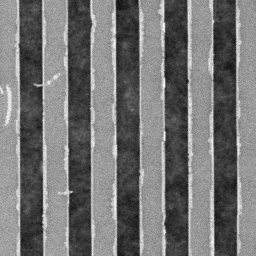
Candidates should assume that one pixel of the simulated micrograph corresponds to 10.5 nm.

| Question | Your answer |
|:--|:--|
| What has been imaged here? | parallel lines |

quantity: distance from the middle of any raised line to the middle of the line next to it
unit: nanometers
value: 510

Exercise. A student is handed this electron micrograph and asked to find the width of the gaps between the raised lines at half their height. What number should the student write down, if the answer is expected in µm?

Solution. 0.258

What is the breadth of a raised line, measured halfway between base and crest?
0.258 µm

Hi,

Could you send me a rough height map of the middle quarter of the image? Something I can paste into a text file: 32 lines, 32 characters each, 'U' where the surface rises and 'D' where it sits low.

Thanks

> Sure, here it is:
UDDDDDDUUUUUUDDDDDDUUUUUUDDDDDDU
UDDDDDDUUUUUUDDDDDDUUUUUUDDDDDDU
UDDDDDDUUUUUUDDDDDDUUUUUUDDDDDDU
UDDDDDDUUUUUUDDDDDDUUUUUUDDDDDDU
UDDDDDDUUUUUUDDDDDDUUUUUUDDDDDDU
UDDDDDDUUUUUUDDDDDDUUUUUUDDDDDDU
UDDDDDDUUUUUUDDDDDDUUUUUUDDDDDDU
UDDDDDDUUUUUUDDDDDDUUUUUUDDDDDDU
UDDDDDDUUUUUUDDDDDDUUUUUUDDDDDDU
UDDDDDDUUUUUUDDDDDDUUUUUUDDDDDDU
UDDDDDDUUUUUUDDDDDDUUUUUUDDDDDDU
UDDDDDDUUUUUUDDDDDDUUUUUUDDDDDDU
UDDDDDDUUUUUUDDDDDDUUUUUUDDDDDDU
UDDDDDDUUUUUUDDDDDDUUUUUUDDDDDDU
UDDDDDDUUUUUUDDDDDDUUUUUUDDDDDDU
UDDDDDDUUUUUUDDDDDDUUUUUUDDDDDDU
UDDDDDDUUUUUUDDDDDDUUUUUUDDDDDDU
UDDDDDDUUUUUUDDDDDDUUUUUUDDDDDDU
UDDDDDDUUUUUUDDDDDDUUUUUUDDDDDDU
UDDDDDDUUUUUUDDDDDDUUUUUUDDDDDDU
UDDDDDDUUUUUUDDDDDDUUUUUUDDDDDDU
UDDDDDDUUUUUUDDDDDDUUUUUUDDDDDDU
UDDDDDDUUUUUUDDDDDDUUUUUUDDDDDDU
UDDDDDDUUUUUUDDDDDDUUUUUUDDDDDDU
UDDDDDDUUUUUUDDDDDDUUUUUUDDDDDDU
UDDDDDDUUUUUUDDDDDDUUUUUUDDDDDDU
UDDDDDDUUUUUUDDDDDDUUUUUUDDDDDDU
UDDDDDDUUUUUUDDDDDDUUUUUUDDDDDDU
UDDDDDDUUUUUUDDDDDDUUUUUUDDDDDDU
UDDDDDDUUUUUUDDDDDDUUUUUUDDDDDDU
UDDDDDDUUUUUUDDDDDDUUUUUUDDDDDDU
UDDDDDDUUUUUUDDDDDDUUUUUUDDDDDDU